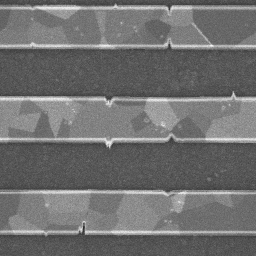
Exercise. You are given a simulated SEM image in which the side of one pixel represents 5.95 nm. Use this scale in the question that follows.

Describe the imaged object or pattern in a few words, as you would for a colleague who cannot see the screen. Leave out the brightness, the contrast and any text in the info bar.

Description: one or a few lines or trenches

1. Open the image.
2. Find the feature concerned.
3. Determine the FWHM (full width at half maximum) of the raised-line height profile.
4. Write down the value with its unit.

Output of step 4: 234 nm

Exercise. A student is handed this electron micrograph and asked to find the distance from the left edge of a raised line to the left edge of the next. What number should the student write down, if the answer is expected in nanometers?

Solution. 552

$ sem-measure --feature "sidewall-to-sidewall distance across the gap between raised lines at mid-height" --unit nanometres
317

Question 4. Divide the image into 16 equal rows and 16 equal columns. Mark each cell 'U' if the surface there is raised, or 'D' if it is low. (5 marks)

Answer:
UDDDDDDUDDDDDDDD
UUUUUUUUUUUUUUUU
UUUUUUUUUUUUUUUU
DDDDDDDDDDDDDDDD
DDDDDDDDDDDDDDDD
DDDDDDDDDDDDDDDD
UUUUUUUUUUUUUUUU
UUUUUUUUUUUUUUUU
UUUUUUUUUUUUUUUU
DDDDDDDDDDDDDDDD
DDDDDDDDDDDDDDDD
DDDDDDDDDDDDDDDD
UUUUUUUUUUUUUUUU
UUUUUUUUUUUUUUUU
DDUDDDUUUUDDDDDD
DDDDDDDDDDDDDDDD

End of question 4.